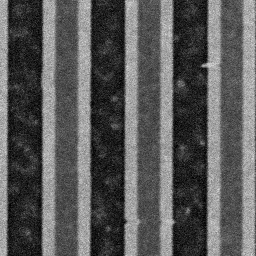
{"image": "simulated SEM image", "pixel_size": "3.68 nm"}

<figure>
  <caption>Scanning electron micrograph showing one or a few lines or trenches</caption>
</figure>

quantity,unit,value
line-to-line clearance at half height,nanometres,172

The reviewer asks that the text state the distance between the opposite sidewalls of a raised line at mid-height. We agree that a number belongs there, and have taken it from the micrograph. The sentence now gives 0.134 um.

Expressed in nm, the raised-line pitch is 304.